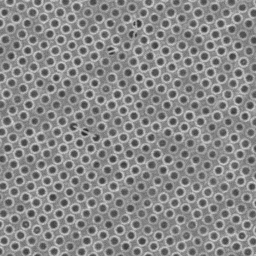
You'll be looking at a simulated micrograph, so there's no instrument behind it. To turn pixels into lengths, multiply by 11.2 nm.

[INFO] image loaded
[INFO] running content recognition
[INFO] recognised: a regular array of holes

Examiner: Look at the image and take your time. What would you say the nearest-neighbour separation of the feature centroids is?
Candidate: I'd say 133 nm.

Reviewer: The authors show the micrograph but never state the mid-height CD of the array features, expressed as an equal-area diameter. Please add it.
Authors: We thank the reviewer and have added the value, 0.0882 microns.